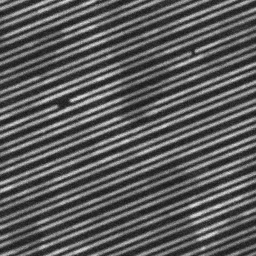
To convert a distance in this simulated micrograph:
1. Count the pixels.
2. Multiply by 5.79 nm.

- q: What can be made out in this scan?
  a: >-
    parallel lines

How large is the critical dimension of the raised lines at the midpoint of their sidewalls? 16.8 nm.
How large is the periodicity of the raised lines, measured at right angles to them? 48.8 nm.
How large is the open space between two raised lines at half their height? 25.5 nm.